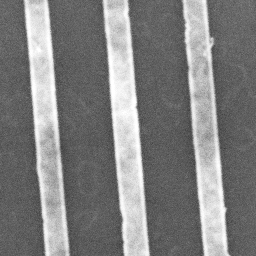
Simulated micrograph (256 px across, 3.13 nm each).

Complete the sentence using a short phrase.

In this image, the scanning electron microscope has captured one or a few lines or trenches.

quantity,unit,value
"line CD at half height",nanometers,67.1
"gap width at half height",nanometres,181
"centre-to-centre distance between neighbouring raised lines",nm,247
